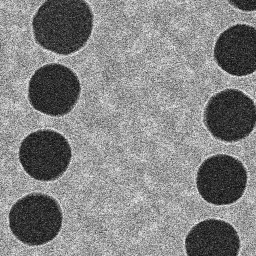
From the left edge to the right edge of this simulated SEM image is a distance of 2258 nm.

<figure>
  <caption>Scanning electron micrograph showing holes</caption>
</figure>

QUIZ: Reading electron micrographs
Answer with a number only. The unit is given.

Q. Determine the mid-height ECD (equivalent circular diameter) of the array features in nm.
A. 459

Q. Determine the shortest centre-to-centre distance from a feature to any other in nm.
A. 577